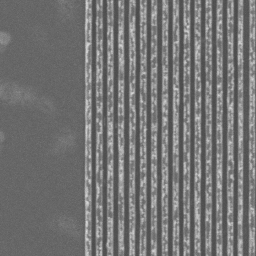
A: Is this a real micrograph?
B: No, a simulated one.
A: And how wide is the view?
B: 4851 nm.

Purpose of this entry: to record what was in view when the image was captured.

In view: parallel lines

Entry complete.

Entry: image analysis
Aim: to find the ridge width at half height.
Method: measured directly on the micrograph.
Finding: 107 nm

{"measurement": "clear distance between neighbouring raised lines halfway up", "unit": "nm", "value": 107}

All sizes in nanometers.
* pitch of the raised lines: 207